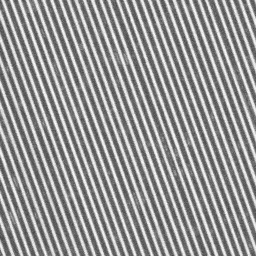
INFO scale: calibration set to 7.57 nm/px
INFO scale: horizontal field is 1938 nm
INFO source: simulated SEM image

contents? parallel lines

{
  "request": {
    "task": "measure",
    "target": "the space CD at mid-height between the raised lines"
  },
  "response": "0.0409 µm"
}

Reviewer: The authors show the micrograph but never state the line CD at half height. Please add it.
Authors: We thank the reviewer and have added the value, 2.71 pixels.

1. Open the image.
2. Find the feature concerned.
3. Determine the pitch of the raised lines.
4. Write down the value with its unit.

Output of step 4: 58.1 nanometers